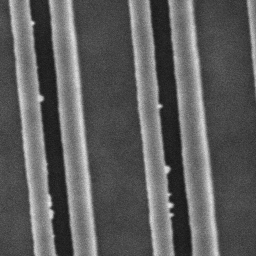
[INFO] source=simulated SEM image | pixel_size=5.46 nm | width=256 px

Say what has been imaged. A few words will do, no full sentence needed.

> lines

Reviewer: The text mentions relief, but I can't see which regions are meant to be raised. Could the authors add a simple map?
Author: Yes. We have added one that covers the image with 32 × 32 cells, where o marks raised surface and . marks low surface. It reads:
.ooo..ooo.......ooo..ooo.......o
.ooo..ooo.......ooo..ooo.......o
.ooo..ooo.......ooo..ooo.......o
..oo..ooo........oo..ooo.......o
..oo...oo........oo..ooo.......o
..oo...oo........oo...oo.......o
..oo...oo........oo...oo........
..oo...oo........oo...ooo.......
..ooo..ooo.......oo...ooo.......
..ooo..ooo.......oo...ooo.......
..ooo..ooo.......ooo..ooo.......
..ooo..ooo.......ooo..ooo.......
..ooo..ooo.......ooo..ooo.......
...oo..ooo.......ooo..ooo.......
...oo...oo.......ooo..ooo.......
...oo...oo........oo...oo.......
...oo...oo........oo...ooo......
...oo...oo........oo...ooo......
...ooo..oo........oo...ooo......
...ooo..ooo.......oo...ooo......
...ooo..ooo.......ooo..ooo......
...ooo..ooo.......ooo..ooo......
...ooo..ooo.......ooo..ooo......
....oo..ooo.......ooo..ooo......
....oo..ooo........oo..ooo......
....oo...oo........oo...oo......
....ooo..oo........oo...ooo.....
....oo...oo........oo...ooo.....
....ooo..ooo.......oo...ooo.....
....ooo..ooo.......oo...ooo.....
....ooo..ooo.......ooo..ooo.....
....ooo..ooo.......ooo..ooo.....